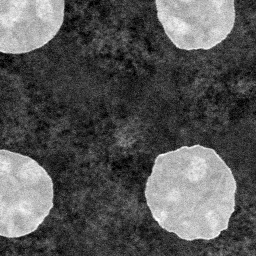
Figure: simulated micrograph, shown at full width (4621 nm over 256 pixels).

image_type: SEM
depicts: raised bodies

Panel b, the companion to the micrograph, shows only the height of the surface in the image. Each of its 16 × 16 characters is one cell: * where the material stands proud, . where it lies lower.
****......*****.
****......*****.
***........***..
................
................
................
................
................
................
*..........**...
***.......****..
***......******.
***......******.
***.......****..
**.........***..
................